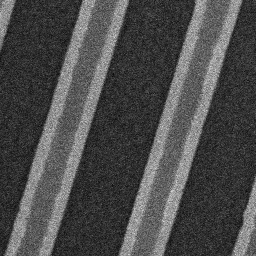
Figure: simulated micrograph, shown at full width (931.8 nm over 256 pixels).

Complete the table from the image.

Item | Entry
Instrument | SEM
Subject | one or a few lines or trenches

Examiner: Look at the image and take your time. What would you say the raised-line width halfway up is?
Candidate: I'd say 130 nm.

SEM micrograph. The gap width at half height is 0.266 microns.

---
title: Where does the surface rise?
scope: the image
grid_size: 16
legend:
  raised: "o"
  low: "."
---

o....ooo....ooo.
.....oo.....oo..
.....oo.....oo..
....ooo....ooo..
....oo.....ooo..
....oo.....oo...
...ooo.....oo...
...ooo....ooo...
...oo.....oo....
..ooo.....oo....
..ooo....ooo....
..oo.....oo.....
..oo.....oo.....
.ooo....ooo....o
.oo.....oo.....o
.oo.....oo.....o